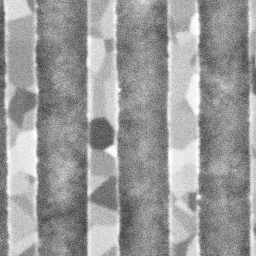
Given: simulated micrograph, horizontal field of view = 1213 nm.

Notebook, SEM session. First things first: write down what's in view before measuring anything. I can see lines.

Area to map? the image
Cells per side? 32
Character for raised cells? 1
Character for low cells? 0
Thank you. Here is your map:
01111000000111000000011110000001
01110000000111000000011110000001
01110000000111100000011110000001
01110000000111000000011110000001
01111000000111000000011110000001
01110000000111000000011110000001
01110000000111000000011110000001
01110000000111000000011110000001
01110000000111000000011110000001
01110000000111100000011110000001
01111000000111100000011110000001
01111000000111100000011110000001
01111000000111100000011110000001
01111000000111100000011110000001
01110000000111100000011110000001
01110000000111100000011110000001
01110000000111100000011110000001
01110000000111100000011110000001
01110000000111100000011110000001
01110000000111100000011110000001
01110000000111100000011110000001
01110000000111100000011110000001
01111000000111100000011110000001
01111000000111100000011110000001
01110000000111100000011110000001
01110000000111100000011110000001
01110000000111100000011110000001
01111000000111100000011110000001
01111000000111100000011110000001
01111000000111100000011110000001
01111000000111100000011110000001
01111000000111100000011110000001